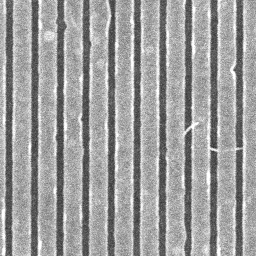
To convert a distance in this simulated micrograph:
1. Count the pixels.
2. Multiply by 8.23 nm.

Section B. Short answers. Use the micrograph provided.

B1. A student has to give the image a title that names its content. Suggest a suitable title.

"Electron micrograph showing parallel lines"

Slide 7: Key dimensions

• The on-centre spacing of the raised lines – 210 nanometres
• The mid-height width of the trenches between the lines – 0.0628 um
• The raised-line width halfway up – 0.146 µm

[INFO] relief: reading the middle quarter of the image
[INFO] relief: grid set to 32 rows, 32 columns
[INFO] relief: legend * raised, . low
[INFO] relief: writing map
*****..****..****..*****..****..
*****..****..****..*****..****..
*****..****..****..*****..****..
*****..****..****..*****..****..
*****..****..****..*****..****..
****...****..****..*****..****..
****...****..****..*****..****..
****...****..****..*****..****..
****...****..****..****...****..
****...****..****..*****..****..
****...****..****..*****..****..
****...****..****..*****..****..
****..*****..****..*****..****..
****..*****..****..*****..****..
****..*****..****..*****..****..
****..*****..****..*****..****..
****..*****..****..*****..****..
****..*****..****..*****..****..
****...****..****..*****..****..
****..*****..****..*****..****..
*****.*****..****..*****..****..
*****.*****..****..*****..****..
*****.*****..****..*****..****..
*****..****..****..*****..****..
****..*****..****..*****..****..
****..*****..****..*****..****..
****..*****..****..*****..****..
****..*****..****..*****..****..
****..*****..****..*****..****..
****..*****..****..*****..****..
****..*****..****..*****..****..
****..*****..****..****...****..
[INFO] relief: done